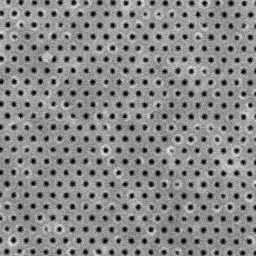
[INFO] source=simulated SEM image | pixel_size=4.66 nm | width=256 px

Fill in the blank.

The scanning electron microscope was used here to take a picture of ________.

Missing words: a regular array of holes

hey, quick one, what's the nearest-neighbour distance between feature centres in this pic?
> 59.5 nanometres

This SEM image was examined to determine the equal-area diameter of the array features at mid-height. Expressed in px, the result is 5.54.